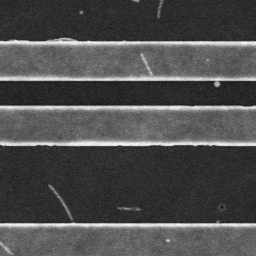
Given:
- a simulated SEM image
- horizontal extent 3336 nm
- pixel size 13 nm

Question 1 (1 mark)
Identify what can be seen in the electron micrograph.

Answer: lines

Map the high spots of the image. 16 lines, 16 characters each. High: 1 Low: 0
0000000000000000
0000000000000000
0000000000000000
1111111111111111
1111111111111111
0000000000000000
0000000000000000
1111111111111111
1111111111111111
0000000000000000
0000000000000000
0000000000000000
0000000000000000
0000000000000000
1111111111111111
1111111111111111